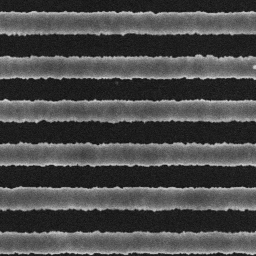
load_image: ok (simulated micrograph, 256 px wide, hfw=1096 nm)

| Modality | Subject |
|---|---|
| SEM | lines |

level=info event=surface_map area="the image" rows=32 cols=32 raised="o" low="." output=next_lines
................................
oo..o...o...oo.o..o.....o.....oo
oooooooooooooooooooooooooooooooo
oooooooooooooooooooooooooooooooo
................................
................................
................................
oooooooooooooooooooooooooooooooo
oooooooooooooooooooooooooooooooo
oooooooooooooooooooooooooooooooo
................................
................................
o.......................oo......
oooooooooooooooooooooooooooooooo
oooooooooooooooooooooooooooooooo
................................
................................
................................
oooooooooooooooooooooooooooooooo
oooooooooooooooooooooooooooooooo
oooooooooooooooooooooooooooooooo
................................
................................
o.ooooooooo.oooooooooo.ooooooooo
oooooooooooooooooooooooooooooooo
oooooooooooooooooooooooooooooooo
................................
................................
................................
oooooooooooooooooooooooooooooooo
oooooooooooooooooooooooooooooooo
oooooooooooooooooooooooooooooooo